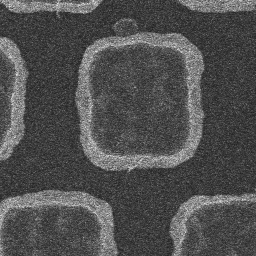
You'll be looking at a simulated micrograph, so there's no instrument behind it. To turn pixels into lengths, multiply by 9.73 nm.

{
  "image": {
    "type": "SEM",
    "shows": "raised bodies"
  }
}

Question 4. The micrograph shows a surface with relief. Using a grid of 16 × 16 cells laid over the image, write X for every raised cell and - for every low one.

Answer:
--XXXX----------
----------------
--------XXX-----
X----XXXXXXX----
X----XXXXXXX----
X----XXXXXXX----
X----XXXXXXX----
X----XXXXXXX----
X----XXXXXXX----
------XXXXXX----
----------------
----------------
-XXXX-------XXXX
XXXXXXX-----XXXX
XXXXXXX----XXXXX
XXXXXXX----XXXXX